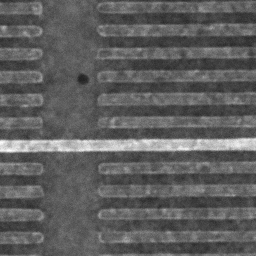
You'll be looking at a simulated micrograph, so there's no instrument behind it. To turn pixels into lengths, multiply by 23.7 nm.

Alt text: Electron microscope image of wiring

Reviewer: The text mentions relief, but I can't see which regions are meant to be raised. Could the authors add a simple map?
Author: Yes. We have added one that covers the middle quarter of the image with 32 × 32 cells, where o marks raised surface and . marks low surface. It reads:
................................
................................
.........ooooooooooooooooooooooo
.........ooooooooooooooooooooooo
................................
................................
................................
................................
.........ooooooooooooooooooooooo
.........ooooooooooooooooooooooo
................................
................................
................................
..........oooooooooooooooooooooo
.........ooooooooooooooooooooooo
.........ooooooooooooooooooo....
................................
................................
................................
oooooooooooooooooooooooooooooooo
oooooooooooooooooooooooooooooooo
ooooo...........................
................................
................................
................................
.........ooooooooooooooooooooooo
.........ooooooooooooooooooooooo
................................
................................
................................
................................
.........ooooooooooooooooooooooo